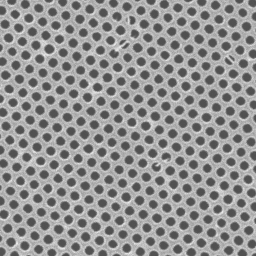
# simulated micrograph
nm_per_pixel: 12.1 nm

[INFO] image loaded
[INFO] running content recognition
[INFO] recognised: a regular array of holes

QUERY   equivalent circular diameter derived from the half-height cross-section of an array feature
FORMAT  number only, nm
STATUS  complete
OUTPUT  114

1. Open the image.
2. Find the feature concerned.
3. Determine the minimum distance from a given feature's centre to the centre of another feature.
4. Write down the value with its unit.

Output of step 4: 168 nm